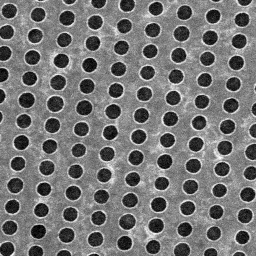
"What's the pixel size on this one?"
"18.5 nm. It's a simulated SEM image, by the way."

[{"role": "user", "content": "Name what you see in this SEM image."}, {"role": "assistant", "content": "a regular array of holes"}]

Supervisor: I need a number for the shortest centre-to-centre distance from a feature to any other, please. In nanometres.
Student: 396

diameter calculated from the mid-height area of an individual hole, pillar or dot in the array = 284 nanometers